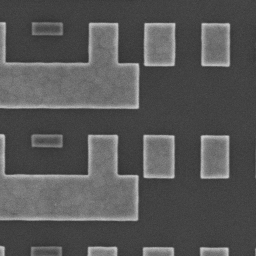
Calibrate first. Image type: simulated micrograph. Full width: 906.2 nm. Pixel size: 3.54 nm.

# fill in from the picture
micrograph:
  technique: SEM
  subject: wiring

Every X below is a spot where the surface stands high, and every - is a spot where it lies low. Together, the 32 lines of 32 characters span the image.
--------------------------------
--------------------------------
--------------------------------
X---XXXX---XXXX---XXXX---XXXX---
X----------XXXX---XXXX---XXXX---
X----------XXXX---XXXX---XXXX---
X----------XXXX---XXXX---XXXX---
X----------XXXX---XXXX---XXXX---
XXXXXXXXXXXXXXXXX---------------
XXXXXXXXXXXXXXXXX---------------
XXXXXXXXXXXXXXXXX---------------
XXXXXXXXXXXXXXXXX---------------
XXXXXXXXXXXXXXXXX---------------
--------------------------------
--------------------------------
--------------------------------
--------------------------------
X---XXXX---XXXX---XXXX---XXXX---
X----------XXXX---XXXX---XXXX---
X----------XXXX---XXXX---XXXX---
X----------XXXX---XXXX---XXXX---
X----------XXXX---XXXX---XXXX---
XXXXXXXXXXXXXXXXX---------------
XXXXXXXXXXXXXXXXX---------------
XXXXXXXXXXXXXXXXX---------------
XXXXXXXXXXXXXXXXX---------------
XXXXXXXXXXXXXXXXX---------------
--------------XXX---------------
--------------------------------
--------------------------------
--------------------------------
X---XXXX---XXXX---XXXX---XXX----